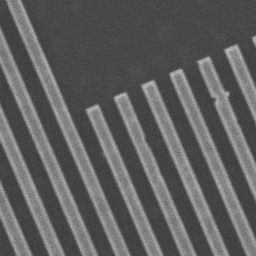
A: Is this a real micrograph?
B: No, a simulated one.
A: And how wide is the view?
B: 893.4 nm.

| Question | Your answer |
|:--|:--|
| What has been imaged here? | parallel lines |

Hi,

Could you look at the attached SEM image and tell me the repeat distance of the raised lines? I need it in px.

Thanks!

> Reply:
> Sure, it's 30.2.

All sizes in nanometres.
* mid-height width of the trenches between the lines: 66.2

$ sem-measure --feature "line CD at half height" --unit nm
38.1